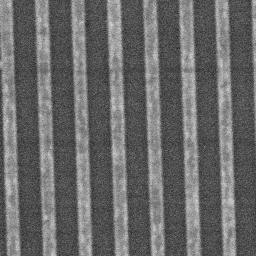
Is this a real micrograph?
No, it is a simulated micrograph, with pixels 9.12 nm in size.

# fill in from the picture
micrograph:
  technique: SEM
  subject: parallel lines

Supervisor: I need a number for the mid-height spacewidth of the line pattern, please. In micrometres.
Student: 0.225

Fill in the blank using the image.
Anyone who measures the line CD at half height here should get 100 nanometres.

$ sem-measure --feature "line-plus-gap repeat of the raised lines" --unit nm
328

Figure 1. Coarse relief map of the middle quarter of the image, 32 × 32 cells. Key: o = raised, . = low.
...oo.......oo.......oo.......oo
...oo.......oo.......oo.......oo
...oo.......oo.......oo.......oo
...oo.......oo.......oo.......oo
...oo.......oo.......oo.......oo
...oo.......oo.......oo.......oo
...oo.......oo.......oo.......oo
...oo.......ooo......oo.......oo
...oo.......ooo......ooo......oo
...oo.......ooo......ooo......oo
...ooo......ooo......ooo......oo
...ooo......ooo......ooo......oo
...ooo......ooo......ooo......oo
...ooo......ooo......ooo......oo
...ooo......ooo......ooo......oo
...ooo......ooo......ooo......oo
...ooo......ooo......ooo......oo
...ooo......ooo......ooo......oo
...ooo......ooo......ooo......oo
...ooo......ooo......ooo......oo
...ooo......ooo......ooo......oo
...ooo......ooo......ooo......oo
...ooo......ooo......ooo......oo
...ooo.......oo......ooo......oo
...ooo.......oo......ooo.......o
...ooo.......oo......ooo.......o
....oo.......oo.......oo.......o
....oo.......oo.......oo.......o
....oo.......oo.......oo.......o
....oo.......oo.......oo.......o
....oo.......oo.......oo.......o
....oo.......oo.......oo.......o